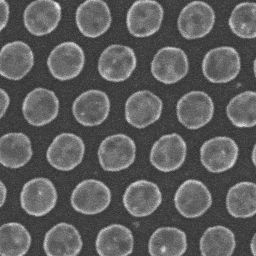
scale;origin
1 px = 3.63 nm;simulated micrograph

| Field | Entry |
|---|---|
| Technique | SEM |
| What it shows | a regular array of raised bodies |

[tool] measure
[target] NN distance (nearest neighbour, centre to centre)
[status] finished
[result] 0.184 microns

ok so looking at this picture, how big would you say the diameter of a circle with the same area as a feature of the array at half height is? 130 nm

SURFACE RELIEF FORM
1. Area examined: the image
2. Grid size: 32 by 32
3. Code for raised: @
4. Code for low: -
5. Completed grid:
@---@@@---@@@----@@@----@@----@@
@--@@@@---@@@@--@@@@---@@@@--@@@
@--@@@@---@@@@--@@@@--@@@@@--@@@
---@@@@---@@@---@@@@--@@@@---@@@
-----------@-----@-----@@-----@@
-@@-----@-----------------------
@@@@---@@@---@@@----@@@---@@@---
@@@@--@@@@--@@@@@--@@@@--@@@@@--
@@@@--@@@@--@@@@@--@@@@--@@@@@--
@@@----@@----@@@---@@@@---@@@---
--------------------------------
@---@@-----@@-----@-------------
@--@@@@--@@@@---@@@@---@@@---@@@
@--@@@@--@@@@@--@@@@--@@@@@-@@@@
---@@@@--@@@@---@@@@--@@@@---@@@
----@-----@@----@@@----@@@---@@@
--------------------------------
@@@@---@@@---@@@----@@@---@@@---
@@@@--@@@@--@@@@@--@@@@--@@@@@--
@@@@--@@@@--@@@@@--@@@@--@@@@@--
@@@---@@@@---@@@---@@@@--@@@@---
--------------------------------
----@@--------------------------
@--@@@@---@@@---@@@@--@@@@---@@@
@--@@@@--@@@@@--@@@@--@@@@--@@@@
---@@@@--@@@@---@@@@--@@@@--@@@@
----@@----@@----@@@----@@----@@@
--------------------------------
@@@----@@----@@@----@-----@@----
@@@@--@@@@--@@@@---@@@@--@@@@---
@@@@--@@@@--@@@@@--@@@@--@@@@--@
@@@---@@@@--@@@@---@@@@--@@@@---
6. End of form